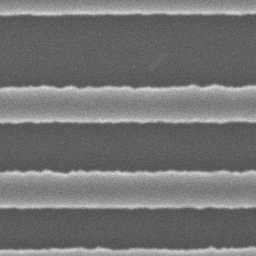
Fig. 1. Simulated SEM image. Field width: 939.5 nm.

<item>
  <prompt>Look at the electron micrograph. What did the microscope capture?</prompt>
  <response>lines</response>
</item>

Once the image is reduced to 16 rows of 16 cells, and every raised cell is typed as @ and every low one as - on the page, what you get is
@@@@@@@@@@@@@@@@
----------------
----------------
----------------
----------------
-@@-@-@@--@@@@-@
@@@@@@@@@@@@@@@@
@@@@@@@@@@@@@@@@
----------------
----------------
----------------
@@@@@@@@@@@@@@@@
@@@@@@@@@@@@@@@@
----------------
----------------
----------------